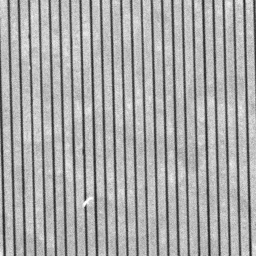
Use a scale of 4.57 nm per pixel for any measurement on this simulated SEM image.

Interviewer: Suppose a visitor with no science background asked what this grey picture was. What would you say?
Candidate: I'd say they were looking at parallel lines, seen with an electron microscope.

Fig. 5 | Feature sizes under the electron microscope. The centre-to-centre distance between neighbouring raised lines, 46.8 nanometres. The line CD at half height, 7.51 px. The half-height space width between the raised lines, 11.4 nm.